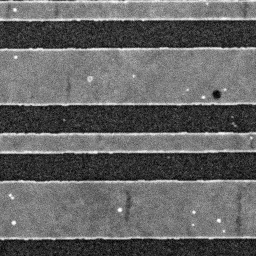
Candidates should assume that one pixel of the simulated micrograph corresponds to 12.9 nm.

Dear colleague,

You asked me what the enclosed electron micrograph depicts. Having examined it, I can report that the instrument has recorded lines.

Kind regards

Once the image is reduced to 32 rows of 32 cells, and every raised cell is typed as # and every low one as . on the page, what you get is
################################
################################
##########..#....#..............
................................
................................
................................
################################
################################
################################
################################
################################
################################
################################
................................
................................
................................
................................
################################
################################
................................
................................
................................
................................
################################
################################
################################
################################
################################
################################
################################
................................
................................